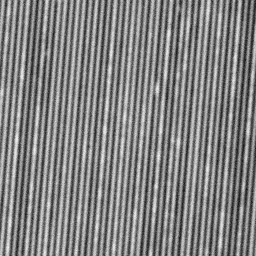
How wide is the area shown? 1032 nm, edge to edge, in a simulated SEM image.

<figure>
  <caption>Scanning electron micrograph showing parallel lines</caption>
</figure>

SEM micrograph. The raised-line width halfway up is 13.5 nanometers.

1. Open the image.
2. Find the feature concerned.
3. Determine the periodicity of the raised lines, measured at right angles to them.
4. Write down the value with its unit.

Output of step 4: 25 nanometres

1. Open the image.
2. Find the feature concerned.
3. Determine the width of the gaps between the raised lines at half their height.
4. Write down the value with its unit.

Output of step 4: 10 nm